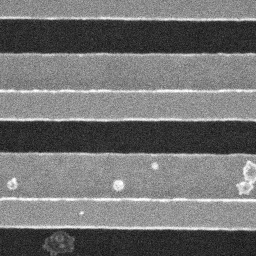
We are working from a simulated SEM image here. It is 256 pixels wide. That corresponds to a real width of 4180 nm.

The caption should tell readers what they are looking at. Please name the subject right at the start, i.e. lines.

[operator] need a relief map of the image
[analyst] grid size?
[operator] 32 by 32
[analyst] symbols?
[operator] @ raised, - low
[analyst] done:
@@@@@@@@@@@@@@@@@@@@@@@@@@@@@@@@
@@@@@@@@@@@@@@@@@@@@@@@@@@@@@@@@
--------------------------------
--------------------------------
--------------------------------
--------------------------------
--------------------------------
@@@@@@@@@@@@@@@@@@@@@@@@@@@@@@@@
@@@@@@@@@@@@@@@@@@@@@@@@@@@@@@@@
@@@@@@@@@@@@@@@@@@@@@@@@@@@@@@@@
@@@@@@@@@@@@@@@@@@@@@@@@@@@@@@@@
@@@@@@@@@@@@@@@@@@@@@@@@@@@@@@@@
@@@@@@@@@@@@@@@@@@@@@@@@@@@@@@@@
@@@@@@@@@@@@@@@@@@@@@@@@@@@@@@@@
@@@@@@@@@@@@@@@@@@@@@@@@@@@@@@@@
--------------------------------
--------------------------------
--------------------------------
--------------------------------
@@@@@@@@@@@@@@@@@@@@@@@@@@@@@@@@
@@@@@@@@@@@@@@@@@@@@@@@@@@@@@@@@
@@@@@@@@@@@@@@@@@@@@@@@@@@@@@@@@
@@@@@@@@@@@@@@@@@@@@@@@@@@@@@@@@
@@@@@@@@@@@@@@@@@@@@@@@@@@@@@@@@
@@@@@@@@@@@@@@@@@@@@@@@@@@@@@@@@
@@@@@@@@@@@@@@@@@@@@@@@@@@@@@@@@
@@@@@@@@@@@@@@@@@@@@@@@@@@@@@@@@
@@@@@@@@@@@@@@@@@@@@@@@@@@@@@@@@
-------------@@@@@@@@@@@@@@@@@@@
--------------------------------
--------------------------------
--------------------------------